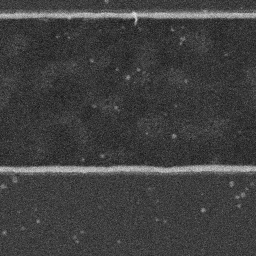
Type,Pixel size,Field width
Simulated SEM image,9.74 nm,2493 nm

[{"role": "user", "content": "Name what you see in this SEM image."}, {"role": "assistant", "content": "one or a few lines or trenches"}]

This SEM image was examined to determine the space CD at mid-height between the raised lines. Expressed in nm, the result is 1480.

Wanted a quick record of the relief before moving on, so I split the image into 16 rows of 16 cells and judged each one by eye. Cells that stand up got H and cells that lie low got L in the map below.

HHHHHHHHHHHHHHHH
LLLLLLLLLLLLLLLL
LLLLLLLLLLLLLLLL
LLLLLLLLLLLLLLLL
LLLLLLLLLLLLLLLL
LLLLLLLLLLLLLLLL
LLLLLLLLLLLLLLLL
LLLLLLLLLLLLLLLL
LLLLLLLLLLLLLLLL
LLLLLLLLLLLLLLLL
LLLLLLLLLLLLHHLL
HHHHHHHHHHHHHHHH
HHHHHHHHHHHHHHHH
HHHHHHHHHHHHHHHH
HHHHHHHHHHHHHHHH
HHHHHHHHHHHHHHHH